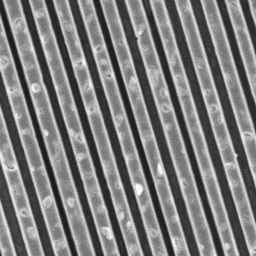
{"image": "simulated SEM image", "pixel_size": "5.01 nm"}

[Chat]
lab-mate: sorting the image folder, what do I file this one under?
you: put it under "parallel lines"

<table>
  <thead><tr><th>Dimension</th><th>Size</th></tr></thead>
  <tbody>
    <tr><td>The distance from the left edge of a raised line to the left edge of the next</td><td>118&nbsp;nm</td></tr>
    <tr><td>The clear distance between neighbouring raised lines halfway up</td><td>42.7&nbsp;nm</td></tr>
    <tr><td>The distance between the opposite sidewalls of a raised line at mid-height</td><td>0.0721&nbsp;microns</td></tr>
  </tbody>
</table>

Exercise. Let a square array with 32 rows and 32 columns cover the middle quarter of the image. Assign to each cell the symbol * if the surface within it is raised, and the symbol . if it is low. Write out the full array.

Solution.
..****..****..****..****..****..
..****...***..****...***..****..
*..***...****.****...****..***..
*..****..****..***...****..****.
*..****...***..****..****..****.
*...***...***..****...****..***.
**..***...****..***...****..***.
**..****..****..***...****..****
**...***...***..****...****..***
***..***...****..***...****..***
***..****..****..***...****..***
***..****...***..****...***..***
****..***...***..****...****..**
****..****..****..***...****..**
****..****...***..****..****..**
****...***...****.****...****..*
.****..***...****..***...****..*
.****..****..****..***...****..*
.****...***...***..****...****..
..****..***...****.****...****..
..****..****..****..***...****..
..****..****...***..****..****..
...***...***...****.****...****.
*..****..***...****..***...****.
*..****..****..****..***...****.
*...***...***...***..****...****
*...****..***...****..***...****
**..****..****..****..***...****
**..****..****...***..****...***
**...****..***...***..****...***
***..****..****..****..***...***
***..****..****...***..****..***